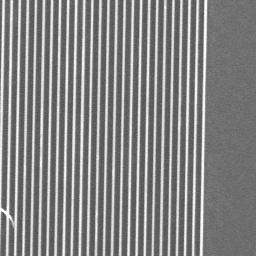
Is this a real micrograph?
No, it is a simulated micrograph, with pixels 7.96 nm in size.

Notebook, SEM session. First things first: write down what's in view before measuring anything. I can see parallel lines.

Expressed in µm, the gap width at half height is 0.0527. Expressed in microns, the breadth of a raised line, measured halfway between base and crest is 0.0149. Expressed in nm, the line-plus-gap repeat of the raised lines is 64.2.